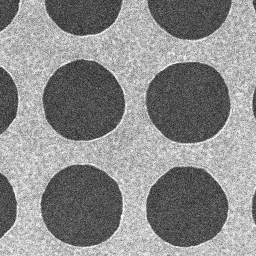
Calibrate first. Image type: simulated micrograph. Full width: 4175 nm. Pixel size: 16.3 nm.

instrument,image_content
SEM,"holes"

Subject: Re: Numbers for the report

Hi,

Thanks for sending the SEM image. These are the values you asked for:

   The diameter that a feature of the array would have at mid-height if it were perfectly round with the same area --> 1350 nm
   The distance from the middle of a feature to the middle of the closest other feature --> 1710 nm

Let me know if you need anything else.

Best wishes